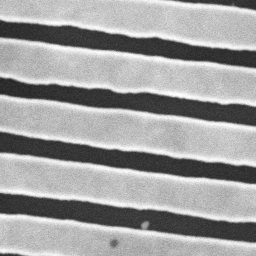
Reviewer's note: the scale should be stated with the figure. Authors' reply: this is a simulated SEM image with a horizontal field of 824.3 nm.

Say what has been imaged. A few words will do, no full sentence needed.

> lines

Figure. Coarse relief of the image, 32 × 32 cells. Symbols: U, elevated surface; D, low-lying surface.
UUUUUUUUUUUUUUUUUUUUUUUUUUDDDDDD
UUUUUUUUUUUUUUUUUUUUUUUUUUUUUUUU
UUUUUUUUUUUUUUUUUUUUUUUUUUUUUUUU
DDDDDDDDDDUUUUUUUUUUUUUUUUUUUUUU
DDDDDDDDDDDDDDDDUUUUUUUUUUUUUUUU
UUUUUUUDDDDDDDDDDDDDDDDDUUUUUUUU
UUUUUUUUUUUUUUUDDDDDDDDDDDDDDDDD
UUUUUUUUUUUUUUUUUUUUUUDDDDDDDDDD
UUUUUUUUUUUUUUUUUUUUUUUUUUUUUUUU
UUUUUUUUUUUUUUUUUUUUUUUUUUUUUUUU
DDDDUUDUUUUUUUUUUUUUUUUUUUUUUUUU
DDDDDDDDDDDDDDUUUUUUUUUUUUUUUUUU
UUUUUDDDDDDDDDDDDDDDDDDDUUUUUUUU
UUUUUUUUUUUUUDDDDDDDDDDDDDDDDDDD
UUUUUUUUUUUUUUUUUUUUUUDDDDDDDDDD
UUUUUUUUUUUUUUUUUUUUUUUUUUUUUUDD
UUUUUUUUUUUUUUUUUUUUUUUUUUUUUUUU
DDDDDDDUUUUUUUUUUUUUUUUUUUUUUUUU
DDDDDDDDDDDDDUUUUUUUUUUUUUUUUUUU
UUUUDDDDDDDDDDDDDDDDDUUUUUUUUUUU
UUUUUUUUUUUUDDDDDDDDDDDDDDDDDUUU
UUUUUUUUUUUUUUUUUUDDDDDDDDDDDDDD
UUUUUUUUUUUUUUUUUUUUUUUUUUUDDDDD
UUUUUUUUUUUUUUUUUUUUUUUUUUUUUUUU
DDDDUUUUUUUUUUUUUUUUUUUUUUUUUUUU
DDDDDDDDDDDDDUUUUUUUUUUUUUUUUUUU
DDDDDDDDDDDDDDDDDDDDDUUUUUUUUUUU
UUUUUUUUDDDDDDDDDDDDDDDDDDDUUUUU
UUUUUUUUUUUUUUUUDDDDDDDDDDDDDDDD
UUUUUUUUUUUUUUUUUUUUUUUDDDDDDDDD
UUUUUUUUUUUUUUUUUUUUUUUUUUUUUUUU
UUUUUUUUUUUUUUUUUUUUUUUUUUUUUUUU